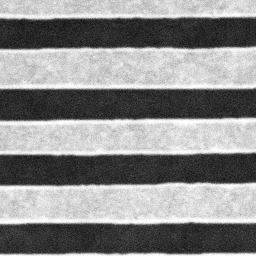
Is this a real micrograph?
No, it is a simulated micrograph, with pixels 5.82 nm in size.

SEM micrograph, lines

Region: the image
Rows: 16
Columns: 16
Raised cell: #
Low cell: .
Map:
################
................
................
################
################
................
................
.........#######
################
#############...
................
...............#
################
################
................
................